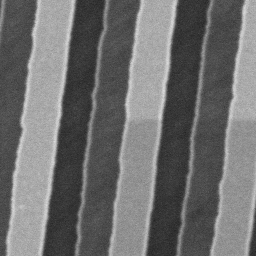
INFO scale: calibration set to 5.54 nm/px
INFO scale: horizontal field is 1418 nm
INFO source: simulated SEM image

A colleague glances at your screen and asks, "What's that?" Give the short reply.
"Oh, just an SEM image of lines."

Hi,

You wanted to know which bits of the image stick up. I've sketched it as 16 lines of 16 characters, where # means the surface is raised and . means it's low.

#####..####..###
####...####..###
####..#####..###
####..#####..###
####..####...###
####..####..####
####..####..####
####..####..####
####..####..####
###..#####..####
###..#####..####
###..#####..####
###..#####..####
###..####..#####
###..####..#####
###..####..#####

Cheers